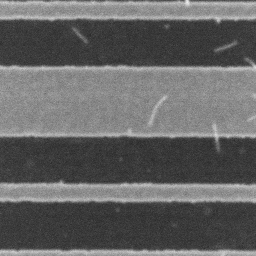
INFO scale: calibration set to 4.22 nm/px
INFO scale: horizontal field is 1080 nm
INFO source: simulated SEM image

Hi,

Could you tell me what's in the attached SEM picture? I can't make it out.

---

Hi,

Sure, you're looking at lines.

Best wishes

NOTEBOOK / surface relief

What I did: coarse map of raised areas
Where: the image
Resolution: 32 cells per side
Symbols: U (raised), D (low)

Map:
UUUUUUUUUUUUUUUUUUUUUUUUUUUUUUUU
UUUUUUUUUUUUUUUUUUUUUUUUUUUUUUUU
DDDDDDDDDDDDDDDDDDDDDDDDDDDUDDDD
DDDDDDDDDDDDDDDDDDDDDDDDDDDDDDDD
DDDDDDDDDDDDDDDDDDDDDDDDDDDDDDDD
DDDDDDDDDDDDDDDDDDDDDDDDDDDDDDDD
DDDDDDDDDDDDDDDDDDDDDDDDDDDDDDDD
DDDDDDDDDDDDDDDDDDDDDDDDDDDDDDDD
UUUUUUUUUUUUUUUUUUUUUUUUUUUUUUUU
UUUUUUUUUUUUUUUUUUUUUUUUUUUUUUUU
UUUUUUUUUUUUUUUUUUUUUUUUUUUUUUUU
UUUUUUUUUUUUUUUUUUUUUUUUUUUUUUUU
UUUUUUUUUUUUUUUUUUUUUUUUUUUUUUUU
UUUUUUUUUUUUUUUUUUUUUUUUUUUUUUUU
UUUUUUUUUUUUUUUUUUUUUUUUUUUUUUUU
UUUUUUUUUUUUUUUUUUUUUUUUUUUUUUUU
UUUUUUUUUUUUUUUUUUUUUUUUUUUUUUUU
DDDDDDDDDUDDDDDDDDDDDDDDDDDDDDDD
DDDDDDDDDDDDDDDDDDDDDDDDDDDDDDDD
DDDDDDDDDDDDDDDDDDDDDDDDDDDDDDDD
DDDDDDDDDDDDDDDDDDDDDDDDDDDDDDDD
DDDDDDDDDDDDDDDDDDDDDDDDDDDDDDDD
DDDDDDDDDDDDDDDDDDDDDDDDDDDDDDDD
UUUUUUUUUUUUUUUUUUUUUUUUUUUUUUUU
UUUUUUUUUUUUUUUUUUUUUUUUUUUUUUUU
DDDDDDDDDDDDDDDDDDDDDDDDDDDDDDDD
DDDDDDDDDDDDDDDDDDDDDDDDDDDDDDDD
DDDDDDDDDDDDDDDDDDDDDDDDDDDDDDDD
DDDDDDDDDDDDDDDDDDDDDDDDDDDDDDDD
DDDDDDDDDDDDDDDDDDDDDDDDDDDDDDDD
DDDDDDDDDDDDDDDDDDDDDDDDDDDDDDDD
UUUUUUUUUUUUUUUUUUUUUUUUUUUUUUUU